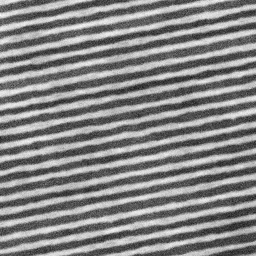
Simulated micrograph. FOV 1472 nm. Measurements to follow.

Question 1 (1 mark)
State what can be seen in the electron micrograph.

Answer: parallel lines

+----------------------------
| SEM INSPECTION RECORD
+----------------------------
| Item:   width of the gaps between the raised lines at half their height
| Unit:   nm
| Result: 45.9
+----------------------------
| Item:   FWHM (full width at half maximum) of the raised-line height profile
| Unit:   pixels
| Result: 4.92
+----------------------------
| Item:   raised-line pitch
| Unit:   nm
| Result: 74.1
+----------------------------